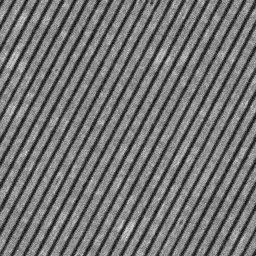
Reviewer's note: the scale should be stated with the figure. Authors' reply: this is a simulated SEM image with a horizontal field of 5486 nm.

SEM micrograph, parallel lines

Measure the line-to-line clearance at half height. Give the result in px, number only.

4.2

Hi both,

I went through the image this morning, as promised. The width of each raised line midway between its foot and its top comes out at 137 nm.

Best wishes